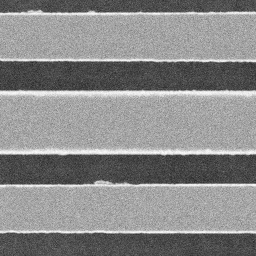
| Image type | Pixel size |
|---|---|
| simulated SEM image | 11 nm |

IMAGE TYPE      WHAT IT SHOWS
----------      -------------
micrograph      lines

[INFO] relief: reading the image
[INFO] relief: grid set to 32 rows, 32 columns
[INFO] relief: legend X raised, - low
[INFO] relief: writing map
--------------------------------
--------------------------------
XXXXXXXXXXXXXXXXXXXXXXXXXXXXXXXX
XXXXXXXXXXXXXXXXXXXXXXXXXXXXXXXX
XXXXXXXXXXXXXXXXXXXXXXXXXXXXXXXX
XXXXXXXXXXXXXXXXXXXXXXXXXXXXXXXX
XXXXXXXXXXXXXXXXXXXXXXXXXXXXXXXX
XXXXXXXXXXXXXXXXXXXXXXXXXXXXXXXX
--------------------------------
--------------------------------
--------------------------------
XXXXXXXXXXXXXXXXXXXXXXXXXXXXXXXX
XXXXXXXXXXXXXXXXXXXXXXXXXXXXXXXX
XXXXXXXXXXXXXXXXXXXXXXXXXXXXXXXX
XXXXXXXXXXXXXXXXXXXXXXXXXXXXXXXX
XXXXXXXXXXXXXXXXXXXXXXXXXXXXXXXX
XXXXXXXXXXXXXXXXXXXXXXXXXXXXXXXX
XXXXXXXXXXXXXXXXXXXXXXXXXXXXXXXX
XXXXXXXXXXXXXXXXXXXXXXXXXXXXXXXX
--------------------------------
--------------------------------
--------------------------------
--------------------------------
XXXXXXXXXXXXXXXXXXXXXXXXXXXXXXXX
XXXXXXXXXXXXXXXXXXXXXXXXXXXXXXXX
XXXXXXXXXXXXXXXXXXXXXXXXXXXXXXXX
XXXXXXXXXXXXXXXXXXXXXXXXXXXXXXXX
XXXXXXXXXXXXXXXXXXXXXXXXXXXXXXXX
XXXXXXXXXXXXXXXXXXXXXXXXXXXXXXXX
--------------------------------
--------------------------------
--------------------------------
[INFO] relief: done